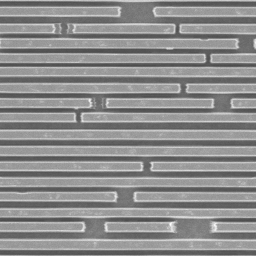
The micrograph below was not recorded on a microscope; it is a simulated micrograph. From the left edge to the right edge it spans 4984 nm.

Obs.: parallel lines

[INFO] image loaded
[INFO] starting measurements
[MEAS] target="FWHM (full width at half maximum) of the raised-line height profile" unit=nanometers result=197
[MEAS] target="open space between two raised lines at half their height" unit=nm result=99.8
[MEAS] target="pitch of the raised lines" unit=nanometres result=302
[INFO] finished